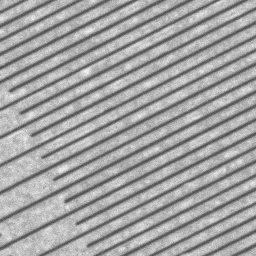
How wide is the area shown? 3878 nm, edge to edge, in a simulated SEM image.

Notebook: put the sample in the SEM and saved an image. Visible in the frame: parallel lines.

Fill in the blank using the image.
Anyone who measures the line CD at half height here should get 140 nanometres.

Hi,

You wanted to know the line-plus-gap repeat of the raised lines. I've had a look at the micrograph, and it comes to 188 nm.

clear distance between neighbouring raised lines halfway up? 55.8 nm